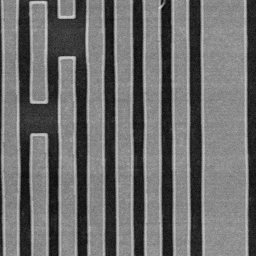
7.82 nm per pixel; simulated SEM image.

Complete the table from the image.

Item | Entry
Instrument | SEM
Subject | groups of lines, slits or small figures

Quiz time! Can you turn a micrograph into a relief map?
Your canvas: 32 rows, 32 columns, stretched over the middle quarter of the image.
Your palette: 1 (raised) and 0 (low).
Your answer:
11100011110001111000111100011110
11000011110001111000111100011110
11000011110001111000111100011110
11000011110001111000111100011110
11000011110001111000111100011110
11000011110001111000111100011110
11100011110001111000111100011110
11100011110001111000111100011110
11100011110001111000111100011110
11100011110001111000111100011110
11100011110001111000111100011110
11100011110001111000111100011110
11100011110001111000111100011110
11100011110001111000111100011110
11100011110001111000111100011110
11100011110001111000111100011110
11100011110001111000111100011110
11100011110001111000111100011110
11100011110001111000111100011110
11100011110001111000111100011110
11100011110001111000111100011110
11100011110001111000111100011110
11100011110001111000111100011110
11100011110001111000111100011110
11100011110001111000111100011110
11100011110001111000111100011110
11100011110001111000111100011110
11100011110001111000111100011110
11100011110001111000111100011110
11100011110001111000111100011110
11100011110001111000111100011110
11100011110001111000111100011110